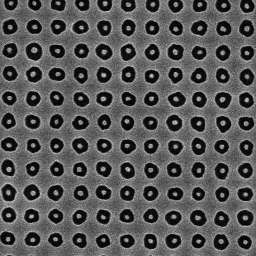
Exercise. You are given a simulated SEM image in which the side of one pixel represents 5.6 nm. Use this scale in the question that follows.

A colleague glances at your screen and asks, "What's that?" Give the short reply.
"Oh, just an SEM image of a regular array of ring-shaped grooves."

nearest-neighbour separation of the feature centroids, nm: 128